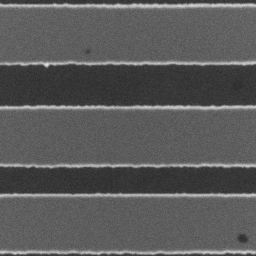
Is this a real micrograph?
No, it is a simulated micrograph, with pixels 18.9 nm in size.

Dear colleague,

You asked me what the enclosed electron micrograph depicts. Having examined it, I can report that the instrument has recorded lines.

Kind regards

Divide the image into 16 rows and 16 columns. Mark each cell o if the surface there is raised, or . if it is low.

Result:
oooooooooooooooo
oooooooooooooooo
oooooooooooooooo
oooooooooooooooo
................
................
................
oooooooooooooooo
oooooooooooooooo
oooooooooooooooo
................
................
oooooooooooooooo
oooooooooooooooo
oooooooooooooooo
oooooooooooooooo